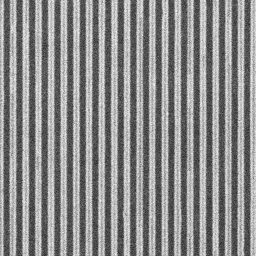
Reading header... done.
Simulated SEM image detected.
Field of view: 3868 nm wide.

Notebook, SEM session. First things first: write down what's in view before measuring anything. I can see parallel lines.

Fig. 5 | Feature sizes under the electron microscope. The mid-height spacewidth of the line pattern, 134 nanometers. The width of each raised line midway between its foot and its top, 58.6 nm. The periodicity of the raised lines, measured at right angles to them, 192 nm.